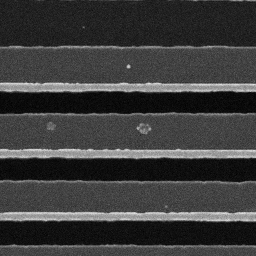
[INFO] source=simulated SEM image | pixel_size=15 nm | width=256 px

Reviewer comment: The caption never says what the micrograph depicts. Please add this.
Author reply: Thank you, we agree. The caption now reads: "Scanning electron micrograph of lines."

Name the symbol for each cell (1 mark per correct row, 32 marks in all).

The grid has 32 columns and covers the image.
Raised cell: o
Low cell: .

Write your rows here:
................................
................................
................................
................................
................................
................................
oooooooooooooooooooooooooooooooo
oooooooooooooooooooooooooooooooo
oooooooooooooooooooooooooooooooo
oooooooooooooooooooooooooooooooo
oooooooooooooooooooooooooooooooo
................................
................................
................................
oooooooooooooooooooooooooooooooo
oooooooooooooooooooooooooooooooo
oooooooooooooooooooooooooooooooo
oooooooooooooooooooooooooooooooo
oooooooooooooooooooooooooooooooo
oooooooooooooooooooooooooooooooo
................................
................................
................................
oooooooooooooooooooooooooooooooo
oooooooooooooooooooooooooooooooo
oooooooooooooooooooooooooooooooo
oooooooooooooooooooooooooooooooo
.oo..o.o.....oo...o.....oooooooo
................................
................................
................................
oooooooooooooooooooooooooooooooo